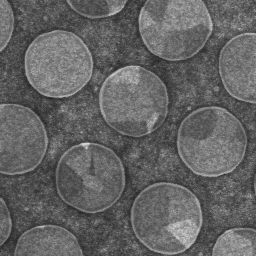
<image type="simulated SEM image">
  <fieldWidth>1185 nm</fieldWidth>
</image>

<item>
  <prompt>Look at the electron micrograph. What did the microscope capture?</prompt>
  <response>raised bodies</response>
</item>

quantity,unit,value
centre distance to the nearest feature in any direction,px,86.6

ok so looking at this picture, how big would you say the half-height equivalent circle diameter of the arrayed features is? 318 nanometers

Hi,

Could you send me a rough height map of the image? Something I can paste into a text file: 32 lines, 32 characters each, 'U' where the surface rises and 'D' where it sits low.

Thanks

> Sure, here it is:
UDDDDDDDDUUUUUUUDDUUUUUUUUDDDDDD
UUDDDDDDDDUUUUUDDDUUUUUUUUDDDDDD
UUDDDDDDDDDDDDDDDUUUUUUUUUDDDDDD
UUDDDDDDDDDDDDDDDUUUUUUUUUDDDDDD
UDDDDUUUUUDDDDDDDDUUUUUUUUDDDDUU
UDDDUUUUUUDDDDDDDDUUUUUUUDDDUUUU
DDDUUUUUUUUDDDDDDDDUUUUUUDDDUUUU
DDDUUUUUUUUUDDDDDDDDDDDDDDDUUUUU
DDDUUUUUUUUUDDDUUUDDDDDDDDDUUUUU
DDDUUUUUUUUDDDUUUUUUDDDDDDDDUUUU
DDDDUUUUUUUDDUUUUUUUDDDDDDDDUUUU
DDDDDUUUUUDDDUUUUUUUUDDDDDDDDUUU
DDDDDDDDDDDDDUUUUUUUUDDDDDDDDDUU
UUUDDDDDDDDDDUUUUUUUUDDDDDUDDDDD
UUUUUDDDDDDDDUUUUUUUUDDDUUUUUDDD
UUUUUDDDDDDDDDUUUUUUDDDUUUUUUUDD
UUUUUUDDDDDDDDDUUUUDDDUUUUUUUUUD
UUUUUUDDDDDDDDDDDDDDDDUUUUUUUUUD
UUUUUUDDDUUUUDDDDDDDDDUUUUUUUUUD
UUUUUDDDUUUUUUUDDDDDDDDUUUUUUUDD
UUUUUDDUUUUUUUUDDDDDDDDUUUUUUUDD
UUUDDDDUUUUUUUUDDDDDDDDDUUUUDDDD
DDDDDDDUUUUUUUUDDDDDDDDDDDDDDDDD
DDDDDDDUUUUUUUUDDDUUUUUDDDDDDDDD
DDDDDDDDUUUUUUUDDUUUUUUUDDDDDDDD
UDDDDDDDDUUUUUDDDUUUUUUUUDDDDDDD
UDDDDDDDDDDUDDDDDUUUUUUUUDDDDDDD
UDDDDDDDDDDDDDDDDUUUUUUUUDDDDDDD
UDDDUUUUDDDDDDDDDUUUUUUUUDDDDDDD
UDDUUUUUUDDDDDDDDUUUUUUUUDDDUUUU
DDUUUUUUUUDDDDDDDDUUUUUUDDDUUUUU
DDUUUUUUUUDDDDDDDDDDUUUDDDDUUUUU